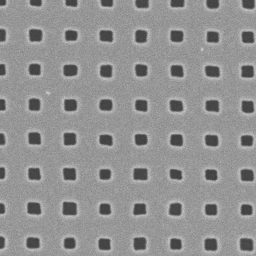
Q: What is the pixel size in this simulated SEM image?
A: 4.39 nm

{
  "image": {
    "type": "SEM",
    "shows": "a regular array of holes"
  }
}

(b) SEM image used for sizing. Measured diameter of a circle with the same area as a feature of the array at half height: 57.3 nanometres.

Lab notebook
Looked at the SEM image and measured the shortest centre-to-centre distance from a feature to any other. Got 151 nanometers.